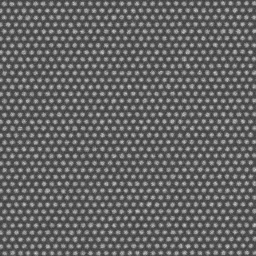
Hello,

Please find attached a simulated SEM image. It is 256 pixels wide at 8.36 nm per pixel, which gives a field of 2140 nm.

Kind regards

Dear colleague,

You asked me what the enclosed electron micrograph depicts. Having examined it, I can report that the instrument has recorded a regular array of raised bodies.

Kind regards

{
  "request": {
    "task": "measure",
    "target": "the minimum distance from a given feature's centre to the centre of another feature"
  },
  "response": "7.5 pixels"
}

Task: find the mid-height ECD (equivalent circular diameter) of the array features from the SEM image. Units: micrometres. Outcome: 0.0353